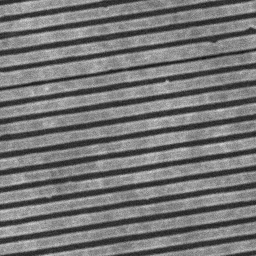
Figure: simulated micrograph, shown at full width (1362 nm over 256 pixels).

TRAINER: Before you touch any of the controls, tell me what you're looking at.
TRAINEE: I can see parallel lines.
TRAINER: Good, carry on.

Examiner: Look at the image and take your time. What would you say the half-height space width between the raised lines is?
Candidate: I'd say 42.1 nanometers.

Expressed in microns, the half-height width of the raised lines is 0.0474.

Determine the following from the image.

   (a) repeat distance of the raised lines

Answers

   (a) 16.8 pixels